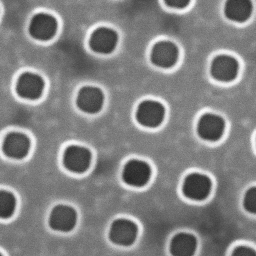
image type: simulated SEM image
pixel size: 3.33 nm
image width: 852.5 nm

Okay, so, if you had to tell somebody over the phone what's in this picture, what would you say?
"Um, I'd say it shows a regular array of holes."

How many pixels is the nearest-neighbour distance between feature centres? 60.8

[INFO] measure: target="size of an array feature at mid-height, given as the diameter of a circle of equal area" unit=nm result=98.2